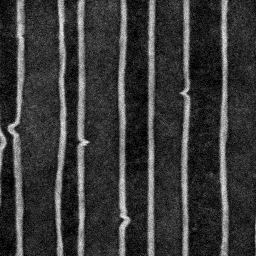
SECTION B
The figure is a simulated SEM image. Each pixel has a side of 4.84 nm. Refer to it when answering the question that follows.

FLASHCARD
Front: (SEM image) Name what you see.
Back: one or a few lines or trenches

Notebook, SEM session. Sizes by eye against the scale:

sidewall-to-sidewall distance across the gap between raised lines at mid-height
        195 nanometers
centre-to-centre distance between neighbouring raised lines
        66.9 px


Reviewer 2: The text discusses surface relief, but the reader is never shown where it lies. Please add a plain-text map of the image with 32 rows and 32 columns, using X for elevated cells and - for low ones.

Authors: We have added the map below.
XXX-----XX-----XXXX----XXXXX----
XXX-----XX-----XXXX----XXXXX----
XXX-----XX-----XXXX----XXXXX----
XXX-----XX-----XXXX----XXXXX----
XXX-----XX-----XXXX----XXXXX----
XXX-----XX-----XXXX----XXXXX----
XXX-----XX-----XXXX----XXXXX----
XX------XX-----XXXX----XXXXX----
XXX-----XX-----XXXX----XXXXX----
XXX-----XX-----XXXX----XXXXX----
XXX-----XX-----XXXX----XXXXX----
XX------XX-----XXXX----XXXXX----
XX------XX-----XXXX----XXXXX----
XX------XX-----XXXX----XXXXX----
XX------XX-----XXXX----XXXXX----
XX------XX-----XXXX----XXXXX----
XX------XX-----XXXX----XXXXX----
XX------XX-----XXXX----XXXXX----
XX------XX-----XXXX----XXXXX----
XX------XX-----XXXX----XXXXX----
XX------XX-----XXXX----XXXXX----
XX-----XXX-----XXXX----XXXXX----
XX-----XXX-----XXXX----XXXXX----
XX-----XXX-----XXXX----XXXXX----
XX-----XXX-----XXXX----XXXXX----
XX-----XXX-----XXXX----XXXXX----
XX-----XXX-----XXXX----XXXXX----
XX-----XXX------XXX----XXXXX----
XX-----XXX-----XXXX----XXXXX----
XXX----XXX-----XXXX----XXXXX----
XX-----XXX-----XXXX----XXXXX----
XXX----XXX-----XXXX----XXXXX----